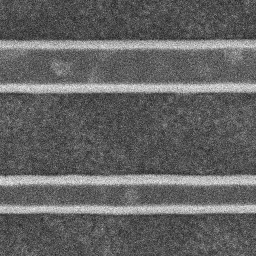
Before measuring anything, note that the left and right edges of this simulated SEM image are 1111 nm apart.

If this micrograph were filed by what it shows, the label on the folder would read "one or a few lines or trenches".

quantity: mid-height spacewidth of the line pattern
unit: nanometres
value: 388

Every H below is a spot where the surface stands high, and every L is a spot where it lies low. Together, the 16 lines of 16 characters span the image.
LLLLLLLLLLLLLLLL
LLLLLLLLLLLLLLLL
LLLLLLLLLLLLLLLL
HHHHHHHHHHHHHHHH
HHHHHHHHHHHHHHHH
HHHHHHHHHHHHHHHH
LLLLLLLLLLLLLLLL
LLLLLLLLLLLLLLLL
LLLLLLLLLLLLLLLL
LLLLLLLLLLLLLLLL
LLLLLLLLLLLLLLLL
HHHHHHHHHHHHHHHH
HHHHHHHHHHHHHHHH
LLLLLLLLLLLLLLLL
LLLLLLLLLLLLLLLL
LLLLLLLLLLLLLLLL